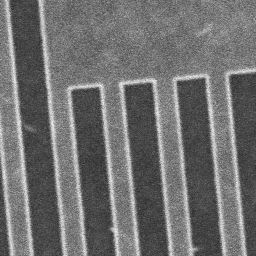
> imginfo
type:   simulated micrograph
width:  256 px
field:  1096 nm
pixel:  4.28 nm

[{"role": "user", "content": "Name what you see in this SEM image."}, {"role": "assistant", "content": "parallel lines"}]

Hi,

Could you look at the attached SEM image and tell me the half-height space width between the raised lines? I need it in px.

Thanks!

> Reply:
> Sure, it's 30.8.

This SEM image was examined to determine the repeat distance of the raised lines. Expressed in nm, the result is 226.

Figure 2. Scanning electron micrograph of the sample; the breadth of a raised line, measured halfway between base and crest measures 0.0948 µm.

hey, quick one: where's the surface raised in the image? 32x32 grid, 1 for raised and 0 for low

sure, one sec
10000111111111111111111111111111
10000111111111111111111111111111
10000111111111111111111111111111
10000111111111111111111111111111
10000111111111111111111111111111
10000011111111111111111111111111
11000011111111111111111111111111
11000011111111111111111111111111
11000011111111111111111111111111
11000011111111111111111111111000
11000011111111110001110000111000
11000011100001100001110000111000
11000011100001100001110000111000
11000011100001110001110000111000
11000011100001110000110000111000
11000011100001110000110000111000
11100001100001110000111000111000
11100001100001110000111000011000
11100001100001110000111000011000
11100001110001110000111000011000
11100001110000110000111000011100
11100001110000110000111000011100
01100001110000110000111000011100
01100001110000111000111000011100
01100001110000111000011000011100
01100001110000111000011000011100
01110000110000111000011000001100
01110000110000111000011100001100
01110000110000111000011100001100
01110000110000111000011100001100
01110000111000111000011100001110
01110000111000011000011100001110